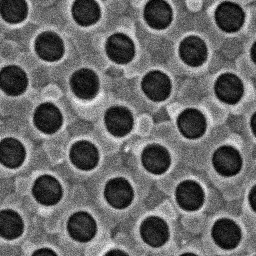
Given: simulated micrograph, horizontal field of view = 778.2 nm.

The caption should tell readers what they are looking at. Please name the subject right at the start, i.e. a regular array of holes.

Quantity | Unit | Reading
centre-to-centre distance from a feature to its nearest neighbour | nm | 153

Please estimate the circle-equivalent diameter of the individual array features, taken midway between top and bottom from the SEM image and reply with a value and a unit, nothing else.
31.6 pixels